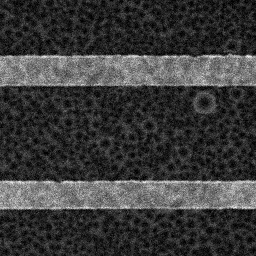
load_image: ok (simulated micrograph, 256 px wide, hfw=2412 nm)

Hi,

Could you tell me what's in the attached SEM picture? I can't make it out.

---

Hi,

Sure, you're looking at one or a few lines or trenches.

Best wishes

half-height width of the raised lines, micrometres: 0.254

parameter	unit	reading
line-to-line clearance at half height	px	96.8